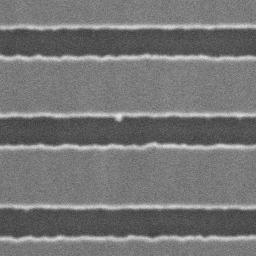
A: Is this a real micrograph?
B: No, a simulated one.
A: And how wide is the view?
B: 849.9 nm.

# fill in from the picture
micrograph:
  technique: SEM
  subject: lines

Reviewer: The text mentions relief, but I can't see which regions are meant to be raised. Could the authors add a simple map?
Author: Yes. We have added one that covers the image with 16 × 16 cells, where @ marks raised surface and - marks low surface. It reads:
@@@@@@@@@@@@@@@@
@@@@@@@@@@@@@@@@
----------------
---------@------
@@@@@@@@@@@@@@@@
@@@@@@@@@@@@@@@@
@@@@@@@@@@@@@@@@
----------------
----------------
@@@@@@@@@@@@@@@@
@@@@@@@@@@@@@@@@
@@@@@@@@@@@@@@@@
@@@@@@@@@@@@@@@@
----------------
----------------
@@@@@@@@@@@@@@@@